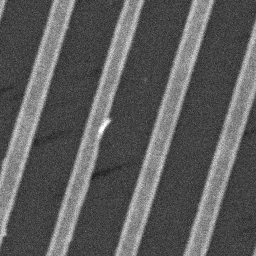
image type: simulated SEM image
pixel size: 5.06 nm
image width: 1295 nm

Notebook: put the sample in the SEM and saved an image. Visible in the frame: one or a few lines or trenches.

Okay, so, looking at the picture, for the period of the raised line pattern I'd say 335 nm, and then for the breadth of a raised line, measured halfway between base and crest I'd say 74.3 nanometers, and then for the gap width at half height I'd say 265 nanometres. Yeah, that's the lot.